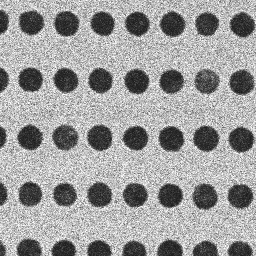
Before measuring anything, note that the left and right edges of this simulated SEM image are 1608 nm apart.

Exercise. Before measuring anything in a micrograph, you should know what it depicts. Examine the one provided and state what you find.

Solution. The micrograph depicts a regular array of holes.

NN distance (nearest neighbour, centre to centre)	218	nanometres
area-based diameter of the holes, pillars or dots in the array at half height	157	nanometres